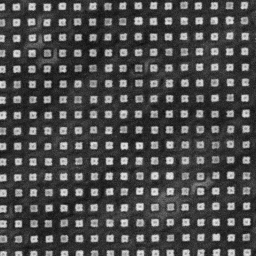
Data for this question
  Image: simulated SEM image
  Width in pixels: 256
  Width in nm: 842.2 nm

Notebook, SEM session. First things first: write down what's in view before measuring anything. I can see a regular array of raised bodies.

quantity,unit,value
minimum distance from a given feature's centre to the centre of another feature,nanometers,49.4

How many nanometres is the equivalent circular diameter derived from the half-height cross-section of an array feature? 24.1